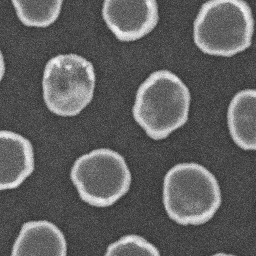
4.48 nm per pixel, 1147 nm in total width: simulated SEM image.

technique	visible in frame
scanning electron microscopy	raised bodies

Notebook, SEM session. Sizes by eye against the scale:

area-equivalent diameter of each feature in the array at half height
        0.251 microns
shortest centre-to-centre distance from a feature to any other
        92.5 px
